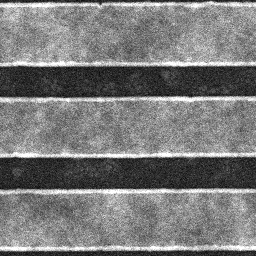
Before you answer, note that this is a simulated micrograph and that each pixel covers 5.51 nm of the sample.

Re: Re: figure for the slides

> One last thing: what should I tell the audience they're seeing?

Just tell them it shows one or a few lines or trenches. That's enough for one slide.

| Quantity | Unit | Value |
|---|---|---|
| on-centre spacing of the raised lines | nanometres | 511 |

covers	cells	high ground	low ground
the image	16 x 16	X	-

XXXXXXXXXXXXXXXX
XXXXXXXXXXXXXXXX
XXXXXXXXXXXXXXXX
XXXXXXXXXXXXXXXX
----------------
----------------
XXXXXXXXXXXXXXXX
XXXXXXXXXXXXXXXX
XXXXXXXXXXXXXXXX
XXXXXXXXXXXXXXXX
----------------
----------------
XXXXXXXXXXXXXXXX
XXXXXXXXXXXXXXXX
XXXXXXXXXXXXXXXX
XXXXXXXXXXXXXXXX